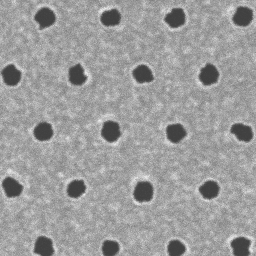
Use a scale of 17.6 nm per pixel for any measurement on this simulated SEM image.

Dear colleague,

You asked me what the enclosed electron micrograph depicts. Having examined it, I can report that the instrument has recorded a regular array of holes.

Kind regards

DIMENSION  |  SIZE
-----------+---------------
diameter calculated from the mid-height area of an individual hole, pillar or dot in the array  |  360 nanometers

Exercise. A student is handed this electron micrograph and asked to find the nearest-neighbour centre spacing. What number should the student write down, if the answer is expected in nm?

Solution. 1140